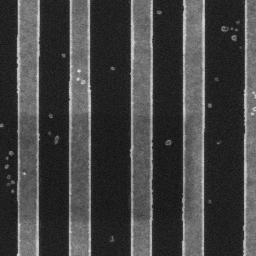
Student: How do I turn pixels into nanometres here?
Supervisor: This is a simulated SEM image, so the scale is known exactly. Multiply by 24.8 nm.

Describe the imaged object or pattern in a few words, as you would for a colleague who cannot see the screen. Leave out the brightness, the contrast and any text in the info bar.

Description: lines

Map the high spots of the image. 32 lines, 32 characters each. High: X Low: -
--XXX----XX-----XXX----XXX-----X
--XXX----XX-----XXX----XXX-----X
--XXX----XX-----XXX----XXX-----X
--XXX----XX-----XXX----XX------X
--XXX----XX------XX----XX------X
--XXX----XX------XX----XX------X
--XXX----XX------XX----XX------X
--XXX----XX-----XXX----XX------X
--XXX----XX-----XXX----XX------X
--XXX----XX-----XXX----XX------X
--XXX----XX-----XXX----XX------X
--XXX----XX-----XXX----XX------X
--XXX----XX-----XXX----XX------X
--XXX----XX-----XXX----XX------X
--XXX----XX-----XXX----XX------X
--XXX----XX-----XXX----XX------X
--XXX----XX-----XXX----XX------X
--XXX----XX-----XXX----XX------X
--XXX----XX-----XXX----XX------X
--XXX----XX-----XXX----XX------X
--XXX----XX-----XXX----XX------X
--XXX----XX-----XXX----XX------X
--XXX----XX-----XXX----XX------X
--XXX----XX-----XXX----XX------X
--XXX----XX-----XXX----XX------X
--XXX----XX-----XXX----XX------X
--XXX----XX-----XXX----XX------X
--XXX----XX------XX----XX------X
--XXX----XX-----XXX----XX------X
--XXX----XX-----XXX----XX------X
--XXX----XX-----XXX----XX------X
--XXX----XX-----XXX----XX------X